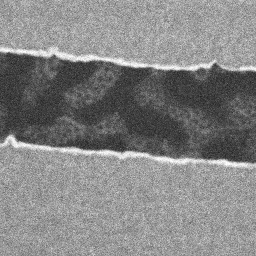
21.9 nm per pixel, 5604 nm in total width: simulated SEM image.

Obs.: one or a few lines or trenches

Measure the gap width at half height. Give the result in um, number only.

2.06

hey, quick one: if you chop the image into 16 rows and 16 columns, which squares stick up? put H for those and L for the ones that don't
HHHHHHHHHHHHHHHH
HHHHHHHHHHHHHHHH
HHHHHHHHHHHHHHHH
LLLLHHHHHHHHHHHH
LLLLLLLLLLLLLLLL
LLLLLLLLLLLLLLLL
LLLLLLLLLLLLLLLL
LLLLLLLLLLLLLLLL
LLLLLLLLLLLLLLLL
HHHHHHLLLLLLLLLL
HHHHHHHHHHHHHHHH
HHHHHHHHHHHHHHHH
HHHHHHHHHHHHHHHH
HHHHHHHHHHHHHHHH
HHHHHHHHHHHHHHHH
HHHHHHHHHHHHHHHH